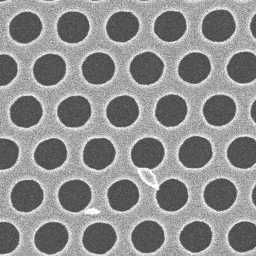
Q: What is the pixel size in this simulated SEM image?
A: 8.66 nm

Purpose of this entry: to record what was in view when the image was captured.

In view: a regular array of holes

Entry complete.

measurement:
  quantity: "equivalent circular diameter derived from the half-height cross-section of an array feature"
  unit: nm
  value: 283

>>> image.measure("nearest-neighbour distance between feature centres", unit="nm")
416